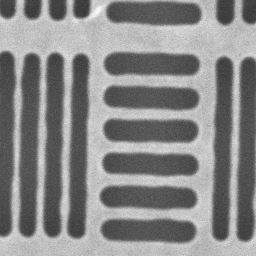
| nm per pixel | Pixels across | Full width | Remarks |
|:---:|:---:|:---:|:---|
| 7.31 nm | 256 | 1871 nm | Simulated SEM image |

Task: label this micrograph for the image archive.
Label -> groups of lines, slits or small figures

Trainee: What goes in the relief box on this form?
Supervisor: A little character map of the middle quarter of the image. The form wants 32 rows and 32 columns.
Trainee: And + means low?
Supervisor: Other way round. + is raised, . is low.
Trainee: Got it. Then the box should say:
++.....+++......................
++.....+++......................
++....+++++.....................
++....++++++++++++++++++++++++++
++....++++++++++++++++++++++++++
++....+++++................+++++
++....++++......................
++....++++......................
++....++++......................
++....++++......................
++....+++++.....................
++....++++++++++++++++++++......
++....++++++++++++++++++++++++++
++....++++++.+++++++++++++++++++
++....++++......................
++....++++......................
++....++++......................
++....++++......................
++....+++++.....................
+.....++++++....................
+.....++++++++++++++++++++++++++
+.....++++++++++++++++++++++++++
+.....+++++.....................
+.....++++......................
+.....+++.......................
+.....+++.......................
+.....++++......................
+.....+++++.....................
+.....++++++++++++++++++++++++++
+.....++++++++++++++++++++++++++
+.....+++++..........+++...+++++
+.....++++......................